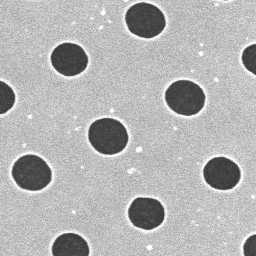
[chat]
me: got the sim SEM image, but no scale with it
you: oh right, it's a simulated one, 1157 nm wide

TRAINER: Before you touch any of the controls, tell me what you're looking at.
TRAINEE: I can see holes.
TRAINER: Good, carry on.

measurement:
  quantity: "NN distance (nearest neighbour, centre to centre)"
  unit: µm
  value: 0.383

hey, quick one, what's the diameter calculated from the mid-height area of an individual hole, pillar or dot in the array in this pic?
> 0.171 µm